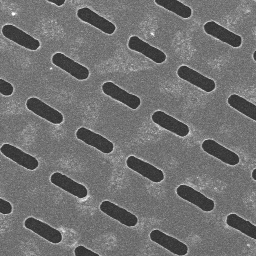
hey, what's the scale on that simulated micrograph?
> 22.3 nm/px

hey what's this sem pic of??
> a regular array of holes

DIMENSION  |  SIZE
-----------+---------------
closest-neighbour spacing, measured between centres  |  51.8 pixels